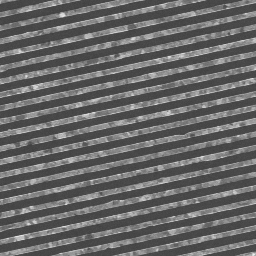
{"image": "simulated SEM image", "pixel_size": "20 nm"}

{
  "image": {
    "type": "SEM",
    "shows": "parallel lines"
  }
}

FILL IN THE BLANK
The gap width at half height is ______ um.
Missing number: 0.159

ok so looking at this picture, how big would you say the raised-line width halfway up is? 5.01 px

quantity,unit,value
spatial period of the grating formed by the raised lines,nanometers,262